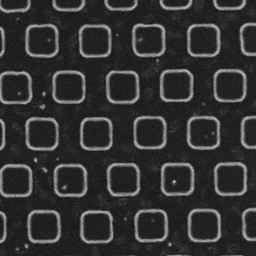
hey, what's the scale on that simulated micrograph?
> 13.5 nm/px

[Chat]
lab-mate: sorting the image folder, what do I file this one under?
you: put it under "a regular array of raised bodies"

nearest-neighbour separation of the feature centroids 0.717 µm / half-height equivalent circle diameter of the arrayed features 455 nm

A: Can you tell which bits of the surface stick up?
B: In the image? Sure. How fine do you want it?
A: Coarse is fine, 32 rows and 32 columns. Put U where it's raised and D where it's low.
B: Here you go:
UUUUDDDUUUDDDUUUUDDDUUUUDDDUUUDD
DDDDDDDDDDDDDDDDDDDDDDDDDDDDDDDD
DDDDDDDDDDDDDDDDDDDDDDDDDDDDDDDD
DDDDUUUDDDUUUDDDDUUUDDDDUUUDDDUU
DDDUUUUDDDUUUUDDDUUUDDDDUUUDDDUU
DDDUUUUDDDUUUUDDDUUUDDDDUUUDDDUU
DDDDUUUDDDUUUUDDDUUUDDDDUUUDDDDU
DDDDDDDDDDDDDDDDDDDDDDDDDDDDDDDD
DDDDDDDDDDDDDDDDDDDDDDDDDDDDDDDD
UUUDDDDUUUDDDDUUUDDDUUUUDDDUUUUD
UUUUDDDUUUDDDUUUUDDDUUUUDDDUUUUD
UUUUDDDUUUDDDUUUUDDDUUUUDDDUUUUD
UUUUDDDUUUDDDDUUUDDDDDDDDDDUUUDD
DDDDDDDDDDDDDDDDDDDDDDDDDDDDDDDD
DDDDDDDDDDDDDDDDDDDDDDDDDDDDDDDD
DDDUUUUDDDUUUUDDDUUUUDDDUUUDDDUU
DDDUUUUDDDUUUUDDDUUUUDDDUUUDDDUU
DDDUUUUDDDUUUUDDDUUUUDDDUUUDDDUU
DDDDUUUDDDDUUDDDDDDDDDDDDDDDDDDD
DDDDDDDDDDDDDDDDDDDDDDDDDDDDDDDD
DDDDDDDDDDDDDDDDDDDDDDDDDDDDDDDD
UUUUDDDUUUUDDDUUUDDDUUUUDDDUUUUD
UUUUDDDUUUUDDDUUUDDDUUUUDDDUUUUD
UUUUDDDUUUUDDDUUUDDDUUUUDDDUUUUD
DDDDDDDDDDDDDDDDDDDDDDDDDDDDDDDD
DDDDDDDDDDDDDDDDDDDDDDDDDDDDDDDD
DDDDUUUDDDDDDDDDDDUUDDDDUUUDDDDU
UDDDUUUDDDUUUUDDDUUUUDDDUUUDDDDU
UDDDUUUDDDUUUUDDDUUUUDDDUUUDDDDU
UDDDUUUDDDUUUUDDDUUUUDDDUUUDDDDU
DDDDDDDDDDDDDDDDDDDDDDDDDDDDDDDD
DDDDDDDDDDDDDDDDDDDDDDDDDDDDDDDD